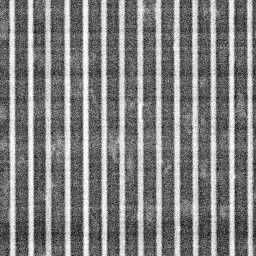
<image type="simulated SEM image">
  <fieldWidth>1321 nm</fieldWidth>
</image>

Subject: parallel lines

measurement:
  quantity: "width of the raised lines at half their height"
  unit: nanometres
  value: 21.9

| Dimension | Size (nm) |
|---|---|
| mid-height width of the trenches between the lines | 72.2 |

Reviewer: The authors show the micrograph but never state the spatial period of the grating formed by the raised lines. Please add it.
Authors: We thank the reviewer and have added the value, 94.3 nanometres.